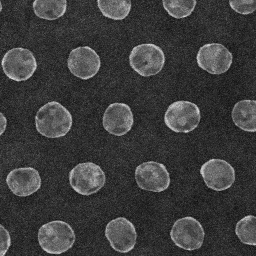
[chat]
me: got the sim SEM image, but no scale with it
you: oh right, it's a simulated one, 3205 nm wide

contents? a regular array of raised bodies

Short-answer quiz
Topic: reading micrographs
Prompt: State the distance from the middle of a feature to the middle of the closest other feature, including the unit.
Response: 64.4 pixels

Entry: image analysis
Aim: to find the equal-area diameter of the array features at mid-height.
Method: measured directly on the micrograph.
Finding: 404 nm